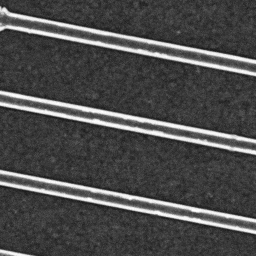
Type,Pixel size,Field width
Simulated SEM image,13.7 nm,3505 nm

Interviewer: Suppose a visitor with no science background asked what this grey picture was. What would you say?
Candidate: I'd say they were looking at one or a few lines or trenches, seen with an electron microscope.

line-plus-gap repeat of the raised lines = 1.07 microns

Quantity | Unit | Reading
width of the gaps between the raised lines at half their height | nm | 894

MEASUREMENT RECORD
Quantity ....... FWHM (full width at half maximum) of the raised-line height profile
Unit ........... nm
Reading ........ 170